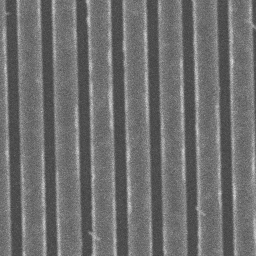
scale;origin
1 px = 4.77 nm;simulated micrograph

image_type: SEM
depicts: parallel lines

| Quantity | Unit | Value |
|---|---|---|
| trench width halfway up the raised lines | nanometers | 54.2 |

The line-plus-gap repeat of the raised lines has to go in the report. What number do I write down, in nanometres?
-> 168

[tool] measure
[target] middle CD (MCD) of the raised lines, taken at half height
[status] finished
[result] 113 nm